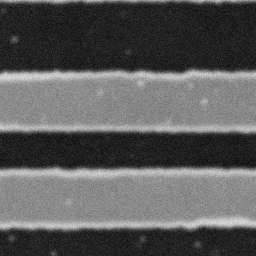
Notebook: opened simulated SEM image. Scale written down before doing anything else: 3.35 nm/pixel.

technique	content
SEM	lines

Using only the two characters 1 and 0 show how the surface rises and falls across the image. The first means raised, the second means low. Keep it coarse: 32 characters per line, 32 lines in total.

00000000000000000000000000000000
00000000000000000000000000000000
00000000000000000000000000000000
00000000000000000000000000000000
00000000000000000000000000000000
00000000000000000000000000000000
00000000000000000000000000000000
00000000000000000000000000000000
00000000000000000000000000000000
11111111111111111111111111111111
11111111111111111111111111111111
11111111111111111111111111111111
11111111111111111111111111111111
11111111111111111111111111111111
11111111111111111111111111111111
11111111111111111111111111111111
00000000000000000000000000000000
00000000000000000000000000000000
00000000000000000000000000000000
00000000000000000000000000000000
00000000000000000000000000000000
11111111111111111111111111111111
11111111111111111111111111111111
11111111111111111111111111111111
11111111111111111111111111111111
11111111111111111111111111111111
11111111111111111111111111111111
11111111111111111111111111111111
10000000110000000000000000000000
00000000000000000000000000000000
00000000000000000000000000000000
00000000000000000000000000000000